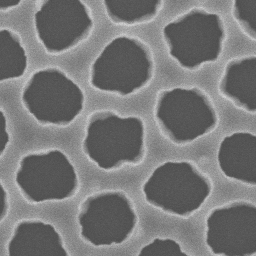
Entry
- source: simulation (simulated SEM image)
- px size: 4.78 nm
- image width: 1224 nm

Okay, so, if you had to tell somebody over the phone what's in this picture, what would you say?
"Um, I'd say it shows a regular array of holes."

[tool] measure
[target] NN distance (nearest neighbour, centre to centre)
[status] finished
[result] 354 nm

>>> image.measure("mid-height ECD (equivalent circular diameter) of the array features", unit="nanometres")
266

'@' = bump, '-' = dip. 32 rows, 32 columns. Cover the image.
--@@@-----@@@-------@@@@@@@@@---
@@@@@------@@------@@@@@-@@@@---
@@@@-------@@@---@@@@@------@@--
@@@@@------@@@@@@@@@@-------@@@-
--@@@-----@@@@@@@@@@@-------@@@@
--@@@@---@@@@@----@@@-------@@@@
---@@@@@@@@@@-----@@@------@@@@@
---@@@@@@@@@-------@@@-----@@@--
---@@@@@@@@@-------@@@@@@@@@----
--@@----@@@@-------@@@@@@@@@----
@@@@-----@@@------@@@@@@@@@@----
@@@-------@@@@@-@@@@@----@@@----
@@@-------@@@@@@@@@@------@@@---
@@@@------@@@@@@@@@@-------@@@@-
@@@@-----@@@--@@@@@@-------@@@@@
-@@@@@@@@@@-------@@-------@@@@@
-@@@@@@@@@@-------@@@-----@@@@@@
-@@@@@@@@@@-------@@@@--@@@@----
-@@@@@@@@@@-------@@@@@@@@@-----
@@@-----@@@------@@@@@@@@@@-----
@@@------@@@---@@@@@@---@@@-----
@@-------@@@@@@@@@@------@@@----
@@--------@@@@@@@@@-------@@@@--
@@@------@@@@@@@@@--------@@@@@@
-@@@-----@@@----@@--------@@@@@@
-@@@@@@@@@@-----@@@------@@@@--@
-@@@@@@@@@-------@@@@@--@@@-----
@@@@@@@@@@-------@@@@@@@@@------
@@-----@@@-------@@@@@@@@@------
@@-----@@@------@@@@@@@@@@------
@-------@@@@--@@@@@---@@@@------
@-------@@@@@@@@@@-----@@@@-----